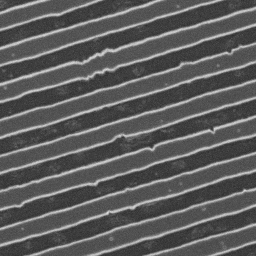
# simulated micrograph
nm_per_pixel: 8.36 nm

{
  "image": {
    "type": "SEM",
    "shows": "parallel lines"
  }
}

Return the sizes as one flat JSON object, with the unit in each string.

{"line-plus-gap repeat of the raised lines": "289 nm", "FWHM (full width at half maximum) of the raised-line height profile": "0.147 micrometres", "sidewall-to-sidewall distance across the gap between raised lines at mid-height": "0.146 um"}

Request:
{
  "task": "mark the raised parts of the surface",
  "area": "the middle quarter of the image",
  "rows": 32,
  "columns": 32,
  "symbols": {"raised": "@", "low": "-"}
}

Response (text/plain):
@@@@@@@@@@@@@@---------------@@@
@@@@@@@@@@-@---------------@@@@@
@@@@@@@@---------------@@@@@@@@@
@@@@@@--------------@@@@@@@@@@@@
@---------------@@@@@@@@@@@@@@--
--------------@@@@@@@@@@@@@@----
---------@@@@@@@@@@@@@@@--------
------@@@@@@@@@@@@@@@-----------
---@@@@@@@@@@@@@@@--------------
@@@@@@@@@@@@@@----------------@@
@@@@@@@@@@----------------@@@@@@
@@@@@@@@----------------@@@@@@@@
@@@@----------------@@@@@@@@@@@@
@---------------@@@@@@@@@@@@@@@-
-------------@@@@@@@@@@@@@@@----
----------@@@@@@@@@@@@@@@-------
-------@@@@@@@@@@@@@@@----------
----@@@@@@@@@@@@@@--------------
@@@@@@@@@@@@@-----------------@@
@@@@@@@@@@@--------------@@@@@@@
@@@@@@@@---------------@@@@@@@@@
@@@@@--------------@@@@@@@@@@@@@
@---------------@@@@@@@@@@@@@@@-
-------------@@@@@@@@@@@@@@@----
----------@@@@@@@@@@@@@@--------
-------@@@@@@@@@@@@@@-----------
---@@@@@@@@@@@@@@@--------------
@@@@@@@@@@@@@@@--------------@@@
@@@@@@@@@@@----------------@@@@@
@@@@@@@@---------------@@@@@@@@@
@@@@---------------@@@@@@@@@@@@@
---------------@@@@@@@@@@@@@@@@@